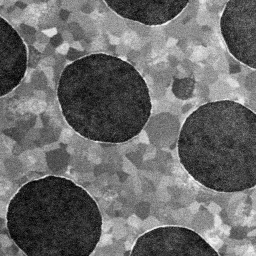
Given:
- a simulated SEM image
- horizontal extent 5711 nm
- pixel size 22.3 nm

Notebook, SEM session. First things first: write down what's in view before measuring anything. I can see holes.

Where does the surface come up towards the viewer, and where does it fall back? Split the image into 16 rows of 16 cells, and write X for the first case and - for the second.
XXXXXXX-----XX--
-XXXXXXXX-XXXX--
-XXXXXXXXXXXXX--
--XXX--XXXXXXXX-
--XX-----XXXXXXX
-XXX-----XXXXXXX
XXXX-----XXXX--X
XXXX-----XXX----
XXXXX---XXX-----
XXXXXXXXXXX-----
XXXXXXXXXXX-----
XX---XXXXXXX----
X-----XXXXXXXXXX
------XXXXXXXXXX
X-----XXX---XXXX
X-----XX-----XXX